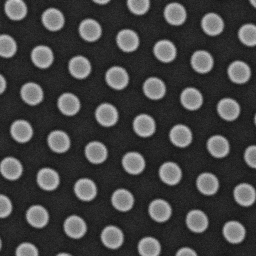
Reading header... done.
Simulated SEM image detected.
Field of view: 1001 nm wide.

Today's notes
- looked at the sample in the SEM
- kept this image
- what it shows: a regular array of raised bodies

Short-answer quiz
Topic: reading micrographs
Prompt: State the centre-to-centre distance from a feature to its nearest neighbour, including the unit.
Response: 150 nm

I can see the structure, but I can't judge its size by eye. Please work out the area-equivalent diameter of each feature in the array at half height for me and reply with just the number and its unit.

82.1 nm